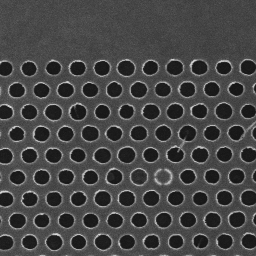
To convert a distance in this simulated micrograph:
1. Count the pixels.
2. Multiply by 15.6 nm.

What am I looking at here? a regular array of holes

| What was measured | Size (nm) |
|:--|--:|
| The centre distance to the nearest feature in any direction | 375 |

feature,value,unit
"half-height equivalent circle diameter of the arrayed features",232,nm